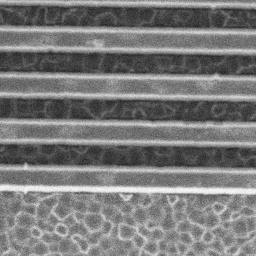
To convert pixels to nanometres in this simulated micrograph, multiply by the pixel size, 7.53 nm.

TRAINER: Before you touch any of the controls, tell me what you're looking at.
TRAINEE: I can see parallel lines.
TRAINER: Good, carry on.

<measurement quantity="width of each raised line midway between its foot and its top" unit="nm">161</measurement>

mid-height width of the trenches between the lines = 188 nm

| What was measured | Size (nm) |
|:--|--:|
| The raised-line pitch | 349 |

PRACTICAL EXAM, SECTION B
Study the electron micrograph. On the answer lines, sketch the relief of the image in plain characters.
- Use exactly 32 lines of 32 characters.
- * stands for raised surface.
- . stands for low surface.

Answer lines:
........*......*****************
................................
................................
................................
********************************
********************************
.......................*****..**
................................
................................
*************...................
********************************
********************************
................................
................................
................................
***********************..**.....
********************************
********************************
................................
................................
................................
********************************
********************************
..******************************
................................
................................
................................
................................
................................
................................
................................
................................